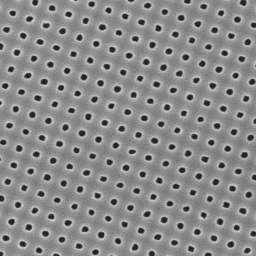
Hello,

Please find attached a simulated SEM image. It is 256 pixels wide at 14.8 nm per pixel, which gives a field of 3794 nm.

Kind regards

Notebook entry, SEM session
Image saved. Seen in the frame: a regular array of holes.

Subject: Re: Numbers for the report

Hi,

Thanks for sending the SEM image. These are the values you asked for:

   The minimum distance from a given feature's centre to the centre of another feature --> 0.259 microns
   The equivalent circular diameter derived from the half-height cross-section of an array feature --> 97.5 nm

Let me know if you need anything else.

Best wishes